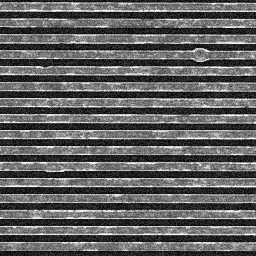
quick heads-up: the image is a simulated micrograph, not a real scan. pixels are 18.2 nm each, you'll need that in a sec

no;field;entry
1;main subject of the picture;parallel lines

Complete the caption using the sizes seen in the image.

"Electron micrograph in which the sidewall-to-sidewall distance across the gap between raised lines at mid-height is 141 nm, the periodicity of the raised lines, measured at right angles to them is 0.291 microns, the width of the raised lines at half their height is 155 nm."